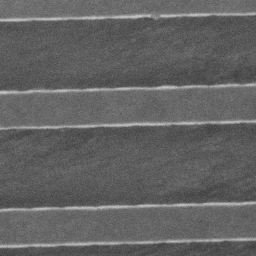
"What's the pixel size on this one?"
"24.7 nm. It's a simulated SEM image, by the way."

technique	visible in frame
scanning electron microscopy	lines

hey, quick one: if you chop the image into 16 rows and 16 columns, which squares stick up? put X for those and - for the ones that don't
XXXXXXXXXXXXXXXX
----------------
----------------
----------------
----------------
----------XXXXXX
XXXXXXXXXXXXXXXX
XXXXXXXXXXXXXXXX
----------------
----------------
----------------
----------------
----------------
XXXXXXXXXXXXXXXX
XXXXXXXXXXXXXXXX
----------------